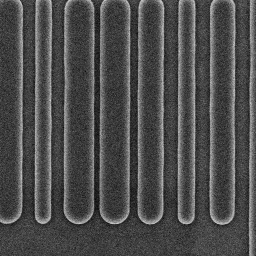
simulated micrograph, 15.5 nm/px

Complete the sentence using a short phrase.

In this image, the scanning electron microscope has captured groups of lines, slits or small figures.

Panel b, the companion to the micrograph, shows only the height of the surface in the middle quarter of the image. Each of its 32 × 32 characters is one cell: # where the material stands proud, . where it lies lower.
#######..#######...######....###
#######..#######...######....###
#######..#######...######....###
#######..#######...######....###
#######..#######...######....###
#######..#######...######....###
#######..#######...######....###
#######..#######...######....###
#######..#######...######....###
#######..#######...######....###
#######..#######...######....###
#######..#######...######....###
#######..#######...######....###
#######..#######...######....###
#######..#######...######....###
#######..#######...######....###
#######..#######...######....###
#######..#######...######....###
#######..#######...######....###
#######..#######...######....###
#######..#######...######....###
#######..#######...######....###
#######..#######...######....###
#######..#######...######....###
#######..#######...######....###
#######..#######...######....###
#######..#######...######....###
#######..#######...######....###
#######..#######...######....###
#######..#######...######....###
#######..#######...######....###
#######..#######...######....###